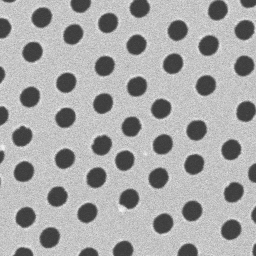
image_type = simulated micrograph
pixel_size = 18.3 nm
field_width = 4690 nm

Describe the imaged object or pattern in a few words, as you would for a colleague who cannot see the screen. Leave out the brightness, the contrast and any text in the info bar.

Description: a regular array of holes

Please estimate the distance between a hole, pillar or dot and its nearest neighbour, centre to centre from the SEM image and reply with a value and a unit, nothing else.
641 nm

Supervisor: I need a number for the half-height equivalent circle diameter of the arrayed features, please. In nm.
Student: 383